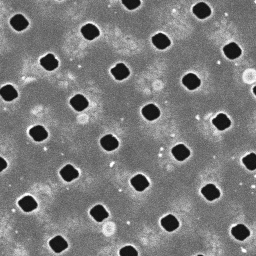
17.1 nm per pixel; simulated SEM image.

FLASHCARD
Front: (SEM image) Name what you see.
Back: a regular array of holes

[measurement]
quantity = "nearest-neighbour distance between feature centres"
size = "854 nm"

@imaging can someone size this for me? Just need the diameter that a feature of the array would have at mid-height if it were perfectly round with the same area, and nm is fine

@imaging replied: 297